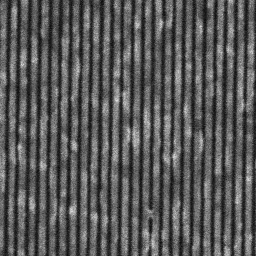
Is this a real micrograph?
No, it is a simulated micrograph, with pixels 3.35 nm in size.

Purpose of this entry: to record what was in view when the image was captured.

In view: parallel lines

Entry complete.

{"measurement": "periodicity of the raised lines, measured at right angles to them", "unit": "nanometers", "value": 34.5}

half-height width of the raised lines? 18.8 nm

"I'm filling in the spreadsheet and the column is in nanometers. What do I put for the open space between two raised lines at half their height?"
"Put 15.5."